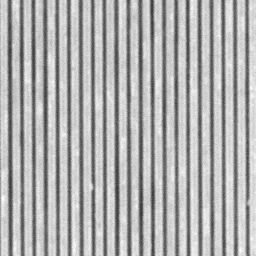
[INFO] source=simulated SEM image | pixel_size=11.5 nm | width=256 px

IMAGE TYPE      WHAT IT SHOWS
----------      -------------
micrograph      parallel lines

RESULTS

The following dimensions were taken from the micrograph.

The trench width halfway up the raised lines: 66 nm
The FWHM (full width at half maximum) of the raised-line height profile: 66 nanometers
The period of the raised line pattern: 136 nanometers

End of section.